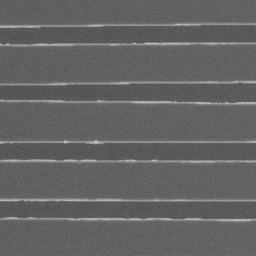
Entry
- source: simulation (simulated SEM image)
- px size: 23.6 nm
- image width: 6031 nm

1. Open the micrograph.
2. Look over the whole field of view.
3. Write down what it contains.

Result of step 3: lines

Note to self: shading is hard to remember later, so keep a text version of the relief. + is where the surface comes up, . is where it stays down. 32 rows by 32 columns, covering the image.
++++++++++++++++++++++++++++++++
++++++++++++++++++++++++++++++++
++++++++++++++++++++++++++++++++
................................
................................
..................++++++++++++++
++++++++++++++++++++++++++++++++
++++++++++++++++++++++++++++++++
++++++++++++++++++++++++++++++++
++++++++++++++++++++++++++++++++
+++++++++.......................
................................
................................
++++++++++++++++++++++++++++++++
++++++++++++++++++++++++++++++++
++++++++++++++++++++++++++++++++
++++++++++++++++++++++++++++++++
++++++++++++++++++++++++++++++++
................................
................................
++++++++++++++++++++++++++++++++
++++++++++++++++++++++++++++++++
++++++++++++++++++++++++++++++++
++++++++++++++++++++++++++++++++
++++++++++++++++++++++++++++++++
................................
................................
++++++++++++++++++++++++++++++++
++++++++++++++++++++++++++++++++
++++++++++++++++++++++++++++++++
++++++++++++++++++++++++++++++++
++++++++++++++++++++++++++++++++